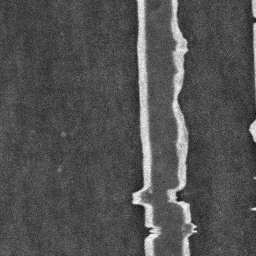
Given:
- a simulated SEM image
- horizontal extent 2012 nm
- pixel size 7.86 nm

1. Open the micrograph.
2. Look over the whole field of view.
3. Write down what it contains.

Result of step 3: one or a few lines or trenches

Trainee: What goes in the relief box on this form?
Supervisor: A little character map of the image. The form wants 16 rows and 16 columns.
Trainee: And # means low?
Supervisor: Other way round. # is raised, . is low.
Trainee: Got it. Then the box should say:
.........##.....
.........##.....
.........##.....
.........##.....
.........##.....
.........##.....
.........##.....
.........##.....
.........##.....
.........##.....
.........##.....
.........##.....
.........##.....
.........###....
..........##....
.........###....